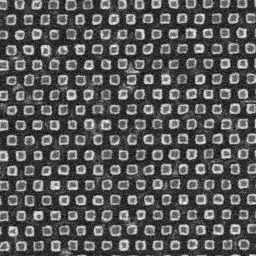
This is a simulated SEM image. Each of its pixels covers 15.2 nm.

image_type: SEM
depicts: a regular array of raised bodies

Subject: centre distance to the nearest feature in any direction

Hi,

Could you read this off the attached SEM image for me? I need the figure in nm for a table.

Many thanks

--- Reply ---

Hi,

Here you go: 253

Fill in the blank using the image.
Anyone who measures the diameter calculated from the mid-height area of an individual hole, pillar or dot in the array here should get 9.37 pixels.